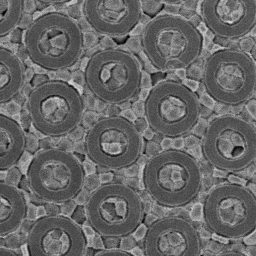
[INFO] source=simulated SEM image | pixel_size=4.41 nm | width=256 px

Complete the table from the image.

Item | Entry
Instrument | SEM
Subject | a regular array of ring-shaped raised bodies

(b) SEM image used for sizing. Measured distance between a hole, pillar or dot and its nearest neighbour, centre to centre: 294 nanometres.